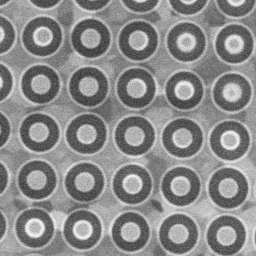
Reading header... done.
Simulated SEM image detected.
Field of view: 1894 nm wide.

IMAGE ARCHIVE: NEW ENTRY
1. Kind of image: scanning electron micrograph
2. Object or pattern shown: an array of small figures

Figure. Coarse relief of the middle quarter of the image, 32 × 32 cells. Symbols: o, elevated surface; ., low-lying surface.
oooooo.ooooooooooooooooooooooooo
ooo......oooooo......ooooooooooo
oo........oooo........ooooo.....
o..........ooo.........ooo......
o..........oo..........ooo......
o..........oo..........oo....oo.
o..........oo..........oo...oooo
o..........oo..........oo...oooo
oo........oooo.........ooo...oo.
ooo......ooooo........oooo......
ooooo...ooooooo......oooooo.....
ooooooooooooooooooooooooooooo..o
ooooo...oooooooooooooooooooooooo
oo.......oooooo.....ooooooooo..o
o.........oooo.......ooooo......
o...oo.....oo.........ooo.......
....oooo...oo..........oo.......
...ooooo...o...........o........
....oooo...o...........o........
o....oo....oo..........o........
o.........ooo.........ooo.......
oo.......ooooo.......oooo.......
oooo....ooooooo.....oooooo......
oooooooooooooooooooooooooooo...o
ooooo.oooooooooooooooooooooooooo
oo.......oooooo.....ooooooooo.oo
o........oooo........ooooo......
..........ooo.........ooo.......
..........oo..........ooo.......
..........oo..........oo........
..........oo..........oo........
..........oo..........oo........